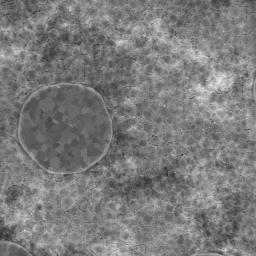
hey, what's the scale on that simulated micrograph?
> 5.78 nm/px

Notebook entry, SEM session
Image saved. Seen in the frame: raised bodies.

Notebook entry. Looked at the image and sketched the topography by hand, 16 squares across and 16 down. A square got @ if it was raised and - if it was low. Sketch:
----------------
----------------
----------------
----------------
----------------
---@@@----------
--@@@@@---------
-@@@@@@---------
-@@@@@@---------
--@@@@@---------
---@@-----------
----------------
----------------
----------------
----------------
@---------------